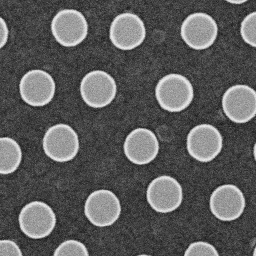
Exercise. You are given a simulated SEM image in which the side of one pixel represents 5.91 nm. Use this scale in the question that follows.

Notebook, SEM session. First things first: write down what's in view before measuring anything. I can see a regular array of raised bodies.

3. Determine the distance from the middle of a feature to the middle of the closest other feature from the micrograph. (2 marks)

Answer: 354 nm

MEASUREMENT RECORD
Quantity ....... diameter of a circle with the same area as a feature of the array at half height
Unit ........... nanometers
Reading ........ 209